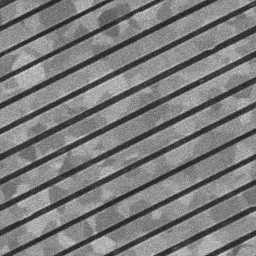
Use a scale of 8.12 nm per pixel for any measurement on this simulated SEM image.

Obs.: parallel lines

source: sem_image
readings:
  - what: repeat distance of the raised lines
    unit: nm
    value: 185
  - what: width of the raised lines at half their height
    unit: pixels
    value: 16.7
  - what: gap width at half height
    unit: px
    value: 6.15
